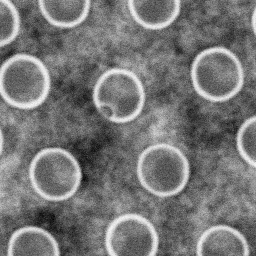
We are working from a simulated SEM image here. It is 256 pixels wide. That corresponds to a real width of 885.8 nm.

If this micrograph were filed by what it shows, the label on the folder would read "raised bodies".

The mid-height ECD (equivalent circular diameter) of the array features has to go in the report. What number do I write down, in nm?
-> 172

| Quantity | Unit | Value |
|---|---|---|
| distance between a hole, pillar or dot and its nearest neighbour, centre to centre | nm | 323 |